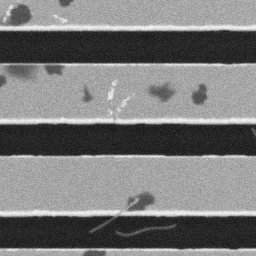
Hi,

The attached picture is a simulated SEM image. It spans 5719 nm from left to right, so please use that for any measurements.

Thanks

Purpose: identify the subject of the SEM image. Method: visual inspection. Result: lines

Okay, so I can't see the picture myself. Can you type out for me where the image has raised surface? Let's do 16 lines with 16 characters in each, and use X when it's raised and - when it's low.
XXXXXXXXXXXXXXXX
XXXXXXXXXXXXXXXX
----------------
----------------
XXXXXXXXXXXXXXXX
XXXXXXXXXXXXXXXX
XXXXXXXXXXXXXXXX
XXXXXXXXXXXXXXXX
----------------
----------------
XXXXXXXXXXXXXXXX
XXXXXXXXXXXXXXXX
XXXXXXXXXXXXXXXX
----------------
----------------
----------------